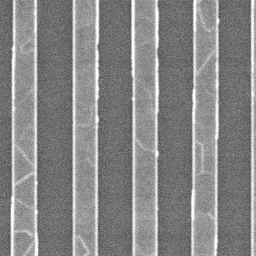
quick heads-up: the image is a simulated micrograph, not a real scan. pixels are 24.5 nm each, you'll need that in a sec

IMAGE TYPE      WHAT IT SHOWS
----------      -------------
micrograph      lines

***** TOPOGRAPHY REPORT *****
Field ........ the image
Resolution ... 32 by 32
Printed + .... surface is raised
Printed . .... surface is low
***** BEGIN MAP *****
..++.....+++.....+++....+++.....
..++.....+++.....+++....+++.....
..++.....+++.....+++....+++.....
..++.....+++.....+++....+++.....
..++.....+++.....+++....+++.....
..++.....+++.....+++....+++.....
..++.....+++.....+++....+++.....
..++.....+++.....+++....+++.....
..++.....+++.....+++....+++.....
..++.....+++.....+++....+++.....
..++.....+++.....+++....+++.....
..++.....+++.....+++....+++.....
..++.....+++.....+++....+++.....
..++.....+++.....+++....+++.....
..++.....+++.....+++....+++.....
..++.....+++.....+++....+++.....
..++.....+++.....+++....+++.....
..++.....+++.....+++....+++.....
..++.....+++.....+++....+++.....
..++.....+++.....+++....+++.....
..++.....+++.....+++....+++.....
..++.....+++.....+++....+++.....
..++.....+++.....+++....+++.....
..++.....+++.....+++....+++.....
..++.....+++.....+++....+++.....
..++.....+++.....+++....+++.....
..++.....+++.....+++....+++.....
..++.....+++.....+++....+++.....
..++.....+++.....+++....+++.....
..+++....+++.....+++....+++.....
..+++....+++.....+++....+++.....
..+++....+++.....+++....+++.....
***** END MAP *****